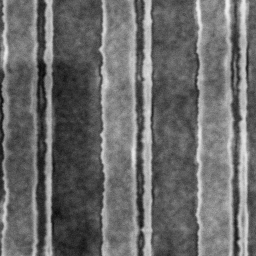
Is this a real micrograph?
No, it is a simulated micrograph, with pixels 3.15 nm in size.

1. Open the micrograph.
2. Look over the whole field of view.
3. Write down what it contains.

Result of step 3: lines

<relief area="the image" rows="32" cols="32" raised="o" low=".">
ooooooo......oooooo......oooooo.
ooooooo......oooooo......oooooo.
ooooooo......oooooo......oooooo.
.oooooo......oooooo......oooooo.
ooooooo......oooooo......oooooo.
ooooooo......oooooo......oooooo.
.oooooo......oooooo......oooooo.
ooooooo......oooooo......oooooo.
ooooooo......oooooo......oooooo.
.oooooo......oooooo......oooooo.
ooooooo......oooooo......oooooo.
oooooo.......oooooo......oooooo.
oooooo.......oooooo......oooooo.
oooooo.......oooooo......oooooo.
oooooo.......oooooo......oooooo.
oooooo.......oooooo......oooooo.
oooooo.......oooooo......oooooo.
oooooo.......oooooo......oooooo.
oooooo.......oooooo......oooooo.
.ooooo.......oooooo......oooooo.
ooooooo......oooooo......oooooo.
oooooo.......oooooo......oooooo.
oooooo.......oooooo......oooooo.
.ooooo.......oooooo......oooooo.
.ooooo.......oooooo......oooooo.
oooooo.......oooooo......oooooo.
oooooo.......oooooo......oooooo.
oooooo.......oooooo......oooooo.
oooooo.......oooooo......oooooo.
oooooo.......oooooo......oooooo.
oooooo.......oooooo......oooooo.
ooooooo......oooooo......oooooo.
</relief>